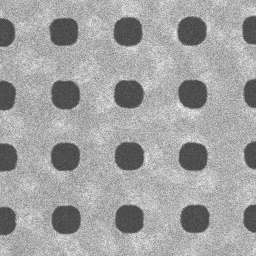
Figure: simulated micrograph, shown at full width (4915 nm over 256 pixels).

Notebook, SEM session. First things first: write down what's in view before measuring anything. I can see a regular array of holes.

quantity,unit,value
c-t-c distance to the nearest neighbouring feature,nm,1190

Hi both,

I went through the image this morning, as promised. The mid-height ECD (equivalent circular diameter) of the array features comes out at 585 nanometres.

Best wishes